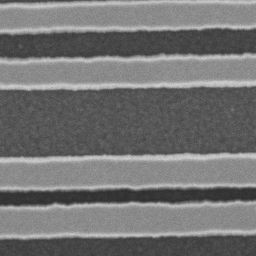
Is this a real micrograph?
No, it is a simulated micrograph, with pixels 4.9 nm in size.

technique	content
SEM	lines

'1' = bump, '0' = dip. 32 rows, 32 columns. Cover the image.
00000001111111111111111111111111
11111111111111111111111111111111
11111111111111111111111111111111
11111111111111111111111111000111
00000000000000000000000000000000
00000000000000000000000000000000
00000000000000000000000000000000
10011111111111111111111111111111
11111111111111111111111111111111
11111111111111111111111111111111
11111111111111111111111111111111
00000000000000000000000000000000
00000000000000000000000000000000
00000000000000000000000000000000
00000000000000000000000000000000
00000000000000000000000000000000
00000000000000000000000000000000
00000000000000000000000000000000
00000000000000000000000000000000
00000000000000000000000100111111
11111111111111111111111111111111
11111111111111111111111111111111
11111111111111111111111111111111
11111111111111101111000100000000
00000000000000000000000000000000
00000010001111111111110111111111
11111111111111111111111111111111
11111111111111111111111111111111
11111111111111111111111111111111
11111111001111110101000000000000
00000000000000000000000000000000
00000000000000000000000000000000